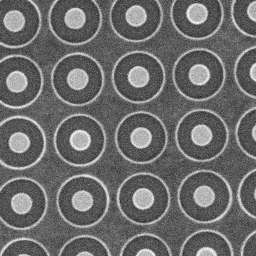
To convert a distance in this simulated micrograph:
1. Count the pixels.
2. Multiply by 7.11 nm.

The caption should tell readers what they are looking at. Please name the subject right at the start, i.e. an array of small figures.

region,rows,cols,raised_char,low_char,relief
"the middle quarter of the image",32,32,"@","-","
---------@@@@-----------@@@@----
---@-----@@@@----@@@-----@@@----
-@@@@----@@@----@@@@@----@@-----
-@@@@@----@@----@@@@@----@@@----
-@@@@@----@@-----@@@@----@@@----
--@@@----@@@@-----@@-----@@@----
---------@@@@-----------@@@@@---
---------@@@@@---------@@@@@@@--
--------@@@@@@@-------@@@@@@@@@@
@-----@@@@@@@@@@@@-@@@@@@@@@@@@@
@@@@@@@@@@@@@@@@@@@@@@@@@@@@@@@@
@@@@@@@@@@@@@@@@@@@@@@@@@@@@@@@@
@@@@@@@@@@@@@@@@@----@@@@@@@@@@-
@------@@@@@@@@--------@@@@@@@--
--------@@@@@@@---------@@@@@---
---------@@@@@-----------@@@@---
----------@@@-----@@@----@@@----
--@@@@----@@@----@@@@@---@@@----
--@@@@----@@@----@@@@@----@@----
--@@@@----@@@----@@@@----@@@----
--@@@@----@@@@----@@-----@@@@---
----------@@@@-----------@@@@---
---------@@@@@@---------@@@@@@--
--------@@@@@@@@-------@@@@@@@@@
@------@@@@@@@@@@@--@@@@@@@@@@@@
@@@@@@@@@@@@@@@@@@@@@@@@@@@@@@@@
@@@@@@@@@@@@@@@@@@@@@@@@@@@@@@@@
@@@@@@@@@@@@@@@@@@@@-@@@@@@@@@@@
@@-----@@@@@@@@@-------@@@@@@@@-
@--------@@@@@@----------@@@@@--
----------@@@@-----------@@@@---
----------@@@@-----@@-----@@@---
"